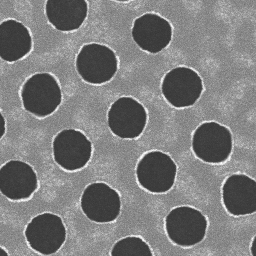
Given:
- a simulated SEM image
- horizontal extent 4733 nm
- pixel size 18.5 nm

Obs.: a regular array of holes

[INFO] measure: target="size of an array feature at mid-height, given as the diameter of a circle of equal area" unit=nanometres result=740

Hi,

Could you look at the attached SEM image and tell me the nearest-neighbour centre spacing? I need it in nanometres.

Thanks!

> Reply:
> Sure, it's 1150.